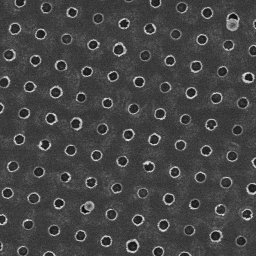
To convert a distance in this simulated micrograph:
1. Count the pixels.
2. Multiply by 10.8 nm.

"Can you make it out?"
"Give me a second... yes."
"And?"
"a regular array of holes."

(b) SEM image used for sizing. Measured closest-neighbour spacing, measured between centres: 0.283 µm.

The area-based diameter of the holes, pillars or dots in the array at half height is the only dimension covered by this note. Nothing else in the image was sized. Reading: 99.6 nm